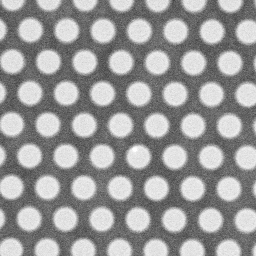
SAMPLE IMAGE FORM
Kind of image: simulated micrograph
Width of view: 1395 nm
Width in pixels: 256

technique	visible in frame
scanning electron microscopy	an array of small figures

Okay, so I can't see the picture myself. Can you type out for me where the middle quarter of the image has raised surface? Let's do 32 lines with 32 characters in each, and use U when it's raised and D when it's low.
DDUUUUUUDDDUUUUUUDDDUUUUUUUDDUUU
DDDUUUUUDDDDUUUUUDDDDUUUUUDDDDUU
DDDDUUUDDDDDDUUUDDDDDDUUUDDDDDDU
DDDDDDDDDDDDDDDDDDDDDDDDDDDDDDDD
UUDDDDDDUUUDDDDDDDUUDDDDDDUUUDDD
UUUDDDDUUUUUDDDDUUUUUDDDDUUUUUDD
UUUUDDUUUUUUUDDDUUUUUUDDDUUUUUUD
UUUUDDUUUUUUUDDUUUUUUUDDDUUUUUUD
UUUUDDDUUUUUUDDDUUUUUUDDDUUUUUUD
UUUDDDDUUUUUDDDDUUUUUDDDDUUUUUDD
UUDDDDDDUUUDDDDDDUUUDDDDDDUUUDDD
DDDDDDDDDDDDDDDDDDDDDDDDDDDDDDDD
DDDUUUUDDDDDUUUUDDDDDDUUUDDDDDDU
DDUUUUUUDDDUUUUUUDDDUUUUUUDDDDUU
DDUUUUUUDDDUUUUUUDDDUUUUUUDDDUUU
DDUUUUUUDDDUUUUUUDDDUUUUUUDDDUUU
DDUUUUUUDDDUUUUUUDDDUUUUUUDDDUUU
DDDUUUUDDDDDUUUUUDDDDUUUUUDDDDUU
DDDDDDDDDDDDDUUDDDDDDDUUDDDDDDDU
DDDDDDDDDDDDDDDDDDDDDDDDDDDDDDDD
UUUDDDDDUUUDDDDDDUUUDDDDDDUUUDDD
UUUDDDDUUUUUDDDDUUUUUDDDDUUUUUDD
UUUUDDUUUUUUUDDUUUUUUUDDDUUUUUUD
UUUUDDUUUUUUUDDUUUUUUUDDUUUUUUUD
UUUDDDDUUUUUUDDDUUUUUUDDDUUUUUUD
UUUDDDDUUUUUDDDDUUUUUDDDDUUUUUDD
DDDDDDDDDDDDDDDDDDDDDDDDDDDDDDDD
DDDDDDDDDDDDDDDDDDDDDDDDDDDDDDDD
DDDUUUUDDDDDUUUUDDDDDUUUUDDDDDUU
DDUUUUUUDDDUUUUUUDDDUUUUUUDDDUUU
DDUUUUUUDDDUUUUUUDDDUUUUUUDDDUUU
DDUUUUUUDDDUUUUUUDDDUUUUUUDDDUUU